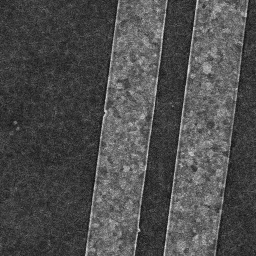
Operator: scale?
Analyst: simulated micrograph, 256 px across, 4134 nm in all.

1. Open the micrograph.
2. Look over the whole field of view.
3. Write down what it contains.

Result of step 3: one or a few lines or trenches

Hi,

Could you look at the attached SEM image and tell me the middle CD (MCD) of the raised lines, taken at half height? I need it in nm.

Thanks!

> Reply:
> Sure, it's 806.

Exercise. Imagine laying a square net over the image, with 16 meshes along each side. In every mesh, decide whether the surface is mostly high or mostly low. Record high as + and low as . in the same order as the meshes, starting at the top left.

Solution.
.......+++..+++.
.......+++..+++.
.......+++..+++.
.......+++..+++.
.......+++..+++.
.......+++..+++.
.......+++..+++.
......++++.++++.
......+++..+++..
......+++..+++..
......+++..+++..
......+++..+++..
......+++..+++..
......+++..+++..
......+++.++++..
.....+++..++++..